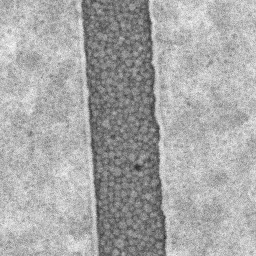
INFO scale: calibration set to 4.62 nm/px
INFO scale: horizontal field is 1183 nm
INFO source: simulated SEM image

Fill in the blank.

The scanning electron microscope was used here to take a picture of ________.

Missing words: one or a few lines or trenches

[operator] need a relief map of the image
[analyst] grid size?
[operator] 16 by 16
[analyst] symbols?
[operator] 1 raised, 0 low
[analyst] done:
1111100001111111
1111100000111111
1111100000111111
1111100000111111
1111100000111111
1111100000111111
1111100000111111
1111100000111111
1111110000111111
1111110000111111
1111110000111111
1111110000111111
1111110000111111
1111110000111111
1111110000011111
1111110000011111